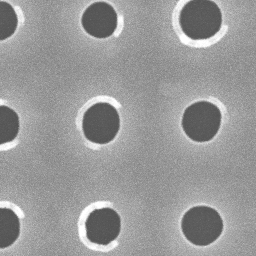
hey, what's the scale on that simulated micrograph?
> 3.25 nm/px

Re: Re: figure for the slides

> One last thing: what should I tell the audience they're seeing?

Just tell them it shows holes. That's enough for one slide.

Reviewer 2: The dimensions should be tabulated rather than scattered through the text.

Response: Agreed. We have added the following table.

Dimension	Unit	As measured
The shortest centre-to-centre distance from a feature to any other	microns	0.328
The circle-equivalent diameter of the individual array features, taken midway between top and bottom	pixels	40.2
